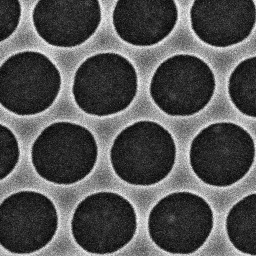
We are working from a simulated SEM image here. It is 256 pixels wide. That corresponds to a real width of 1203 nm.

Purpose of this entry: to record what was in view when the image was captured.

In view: holes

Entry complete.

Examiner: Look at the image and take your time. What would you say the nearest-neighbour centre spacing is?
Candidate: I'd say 365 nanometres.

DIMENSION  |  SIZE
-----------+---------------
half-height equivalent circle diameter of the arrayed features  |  0.304 µm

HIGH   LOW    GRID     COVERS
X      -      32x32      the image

---XX-------XX--------XX--------
---X---------X--------XX--------
--XX---------X--------XX--------
--XX--------XX--------XX--------
-XXXX------XXXX------XXXX------X
XXXXXX----XXXXXX---XXXXXXX---XXX
XXX-XXXXXXXXXXXXXXXXXXXXXXXXXXXX
X-----XXXXX-----XXXXX----XXXXXX-
-------XXX-------XXX------XXX---
--------X--------XX--------XX---
--------X--------XX--------X----
-------XX--------XX--------XX---
-------XX--------XX-------XXX---
X-----XXXX------XXXX------XXXX--
XXXXXXXXXXXXXXXXXXXXXX-XXXXXXXX-
XXXXXXX---XXXXXXX---XXXXXXX---XX
--XXX------XXXX------XXXX------X
--XX--------XX--------XX--------
--XX--------XX--------XX--------
--XX--------XX--------XX--------
--XX--------XX--------XX--------
-XXXX------XXX-------XXX-------X
XXXXXX----XXXXX-----XXXXX-----XX
XXXXXXXXXXXXXXXXXXXXXXXXXXXXXXXX
X-----XXXXX----XXXXXX----XXXXXX-
-------XXX------XXXX------XXX---
-------XX--------XX--------XX---
-------XX--------XX--------X----
-------XX--------X---------X----
-------XX--------XX-------XX----
------XXXX------XXX------XXXX---
X---XXXXXXX---XXXXXXX---XXXXXX--